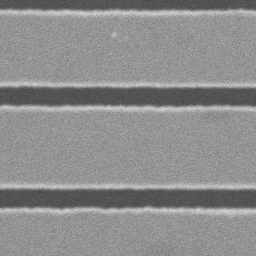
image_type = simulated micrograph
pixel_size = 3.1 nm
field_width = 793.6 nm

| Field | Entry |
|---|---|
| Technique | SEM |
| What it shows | lines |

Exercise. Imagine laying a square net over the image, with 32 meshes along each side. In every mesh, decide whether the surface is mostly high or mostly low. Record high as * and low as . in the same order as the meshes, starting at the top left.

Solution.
................................
********************************
********************************
********************************
********************************
********************************
********************************
********************************
********************************
********************************
********************************
................................
................................
********************************
********************************
********************************
********************************
********************************
********************************
********************************
********************************
********************************
********************************
********************************
................................
................................
********************************
********************************
********************************
********************************
********************************
********************************